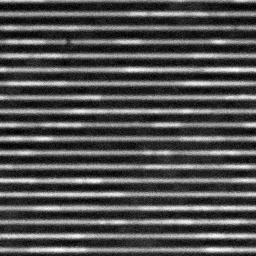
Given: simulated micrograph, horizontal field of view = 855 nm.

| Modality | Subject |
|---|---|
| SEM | parallel lines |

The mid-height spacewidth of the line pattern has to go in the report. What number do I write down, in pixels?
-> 10.5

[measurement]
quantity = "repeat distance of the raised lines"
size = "46.3 nanometres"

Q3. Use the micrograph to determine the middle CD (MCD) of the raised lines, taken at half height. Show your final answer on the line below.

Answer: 11.7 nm